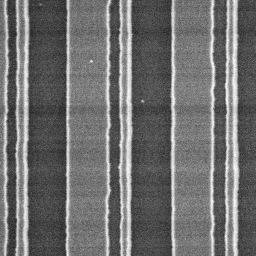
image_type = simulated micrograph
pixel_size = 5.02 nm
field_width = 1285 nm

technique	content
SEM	lines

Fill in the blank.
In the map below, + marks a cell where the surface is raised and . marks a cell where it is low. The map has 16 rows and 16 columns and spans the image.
++..++++...++++.
++..++++...++++.
++..++++...++++.
++..++++...++++.
++..++++...++++.
++..++++...++++.
++..++++...++++.
++..++++...++++.
++..++++...++++.
++..++++...++++.
++..++++...++++.
++..++++...++++.
++..++++...++++.
++..++++...++++.
++..++++...++++.
++..++++...++++.